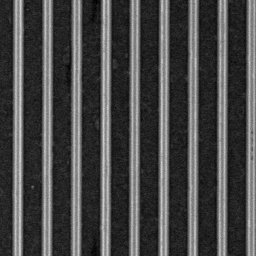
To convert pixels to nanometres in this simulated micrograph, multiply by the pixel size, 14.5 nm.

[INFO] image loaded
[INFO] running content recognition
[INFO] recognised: parallel lines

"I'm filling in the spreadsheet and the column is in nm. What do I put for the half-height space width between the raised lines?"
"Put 316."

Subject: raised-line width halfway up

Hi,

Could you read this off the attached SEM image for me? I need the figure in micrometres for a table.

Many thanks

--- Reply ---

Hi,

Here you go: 0.11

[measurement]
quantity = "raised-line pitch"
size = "422 nm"